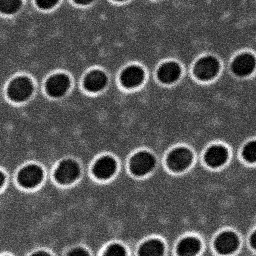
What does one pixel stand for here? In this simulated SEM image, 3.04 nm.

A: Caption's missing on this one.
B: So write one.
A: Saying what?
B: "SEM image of a regular array of holes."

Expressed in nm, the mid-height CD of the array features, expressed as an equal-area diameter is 78.6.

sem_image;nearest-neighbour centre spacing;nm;113